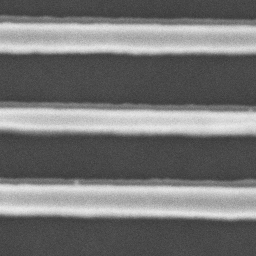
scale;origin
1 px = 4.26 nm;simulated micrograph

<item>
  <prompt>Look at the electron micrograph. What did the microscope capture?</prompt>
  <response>lines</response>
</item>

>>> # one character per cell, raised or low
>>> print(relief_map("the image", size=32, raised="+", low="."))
................................
................................
................................
++++++++++++++++++++++++++++++++
++++++++++++++++++++++++++++++++
++++++++++++++++++++++++++++++++
.+++.++++.++..++++++++++++++++++
................................
................................
................................
................................
................................
................................
................................
++++++++++++++++++++++++++++++++
++++++++++++++++++++++++++++++++
.............+++++++++++++++++++
................................
................................
................................
................................
................................
................................
++++++++++++++++++++++++++++++++
++++++++++++++++++++++++++++++++
++++++++++++++++++++++++++++++++
++++++++++++++++++++++++++++++++
................................
................................
................................
................................
................................